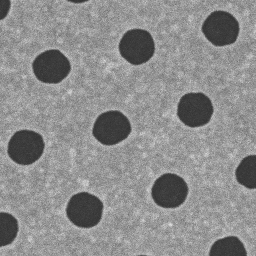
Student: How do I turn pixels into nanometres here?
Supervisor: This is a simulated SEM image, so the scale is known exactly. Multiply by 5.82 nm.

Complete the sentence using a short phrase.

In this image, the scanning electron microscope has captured a regular array of holes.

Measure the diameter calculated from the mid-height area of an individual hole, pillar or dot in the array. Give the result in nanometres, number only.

212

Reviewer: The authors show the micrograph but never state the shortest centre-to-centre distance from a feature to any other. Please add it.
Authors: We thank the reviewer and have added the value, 496 nanometres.